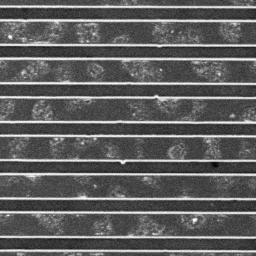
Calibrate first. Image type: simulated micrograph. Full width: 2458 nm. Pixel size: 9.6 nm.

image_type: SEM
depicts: parallel lines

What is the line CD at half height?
0.242 micrometres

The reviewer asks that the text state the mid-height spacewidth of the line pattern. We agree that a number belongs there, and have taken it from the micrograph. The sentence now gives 130 nanometres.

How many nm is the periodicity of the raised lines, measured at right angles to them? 369